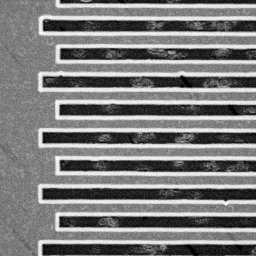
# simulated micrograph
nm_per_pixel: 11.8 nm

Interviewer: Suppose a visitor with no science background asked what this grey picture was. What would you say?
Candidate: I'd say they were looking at parallel lines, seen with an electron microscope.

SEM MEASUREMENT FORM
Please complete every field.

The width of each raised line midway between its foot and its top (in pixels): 13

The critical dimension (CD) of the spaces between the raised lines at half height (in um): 0.173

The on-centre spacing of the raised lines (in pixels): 28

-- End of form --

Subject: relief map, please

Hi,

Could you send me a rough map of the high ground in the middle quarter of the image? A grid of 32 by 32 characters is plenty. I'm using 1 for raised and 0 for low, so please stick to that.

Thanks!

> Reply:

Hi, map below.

11111111111111111111111111111111
11111111111111111111111111111111
00000000000000000001111111111011
00000000000000000000000000000000
00000000000000000000000000000000
00000000000000000000000000000000
11111111111111111111111111111111
11111111111111111111111111111111
11111111111111111111111111111111
00000000000000000000000001111000
00000000000000000000000000000000
00000000000000000000000000000000
00000000000000000000000000000000
00000000000000000111111111100000
11111111111111111111111111111111
11111111111111111111111111111111
11111111111111111111111111111111
00000000000000000000000000000000
00000000000000000000000000000000
00000000000000000000000000000000
11100000000000000000000000000000
11111111111111111111111111111111
11111111111111111111111111111111
01111111111111111111111111111111
00000000000000000000000000000000
00000000000000000000000000000000
00000000000000000000000000000000
11111111111111111111111111110000
11111111111111111111111111111111
11111111111111111111111111111111
00000000000001100000000001111111
00000000000000000000000000000000